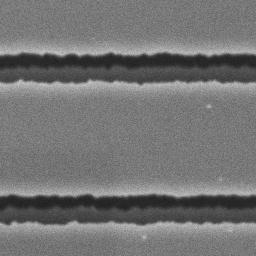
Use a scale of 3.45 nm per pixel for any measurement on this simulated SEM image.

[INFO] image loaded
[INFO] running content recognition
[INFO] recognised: lines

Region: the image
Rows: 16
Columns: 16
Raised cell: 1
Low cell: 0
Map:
1111111111111111
1111111111111111
1111111111111111
0000000000000000
0000000000000000
1111111111111111
1111111111111111
1111111111111111
1111111111111111
1111111111111111
1111111111111111
1111111111111111
0000000000000000
0001000000000000
1111111111111111
1111111111111111